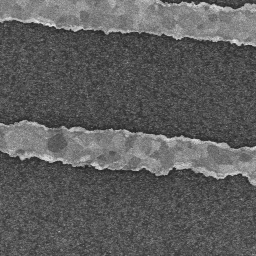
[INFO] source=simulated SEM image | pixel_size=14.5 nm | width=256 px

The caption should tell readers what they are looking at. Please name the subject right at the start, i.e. one or a few lines or trenches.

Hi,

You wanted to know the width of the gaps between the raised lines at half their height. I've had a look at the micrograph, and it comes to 1470 nm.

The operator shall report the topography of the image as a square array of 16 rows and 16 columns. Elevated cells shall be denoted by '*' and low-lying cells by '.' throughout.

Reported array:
**************.*
...*************
..............**
................
................
................
................
................
**********......
****************
......*****.****
................
................
................
................
................